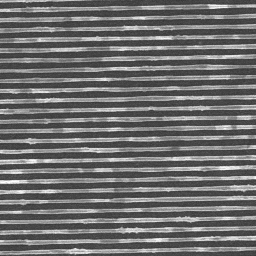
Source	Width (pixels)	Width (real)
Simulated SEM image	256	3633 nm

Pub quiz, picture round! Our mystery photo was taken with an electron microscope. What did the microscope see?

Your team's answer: parallel lines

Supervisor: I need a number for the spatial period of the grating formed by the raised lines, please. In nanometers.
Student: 143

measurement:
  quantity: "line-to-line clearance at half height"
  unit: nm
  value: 97.5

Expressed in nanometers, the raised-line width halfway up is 37.2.